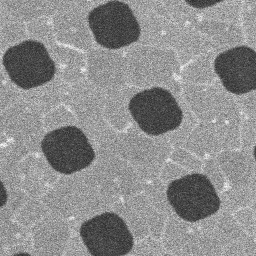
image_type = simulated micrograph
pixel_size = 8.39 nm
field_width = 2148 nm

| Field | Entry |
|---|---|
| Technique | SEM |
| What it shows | holes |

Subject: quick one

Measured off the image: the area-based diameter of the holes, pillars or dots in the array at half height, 417 nanometres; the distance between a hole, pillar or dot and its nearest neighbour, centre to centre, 787 nanometers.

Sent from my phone